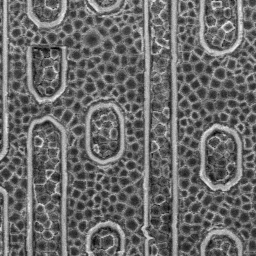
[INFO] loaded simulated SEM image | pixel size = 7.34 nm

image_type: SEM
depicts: parallel lines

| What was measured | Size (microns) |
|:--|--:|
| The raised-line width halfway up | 0.186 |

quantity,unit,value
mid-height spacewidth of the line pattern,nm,230